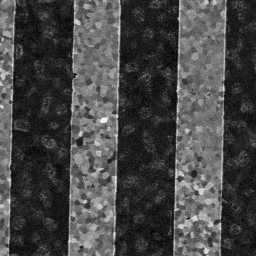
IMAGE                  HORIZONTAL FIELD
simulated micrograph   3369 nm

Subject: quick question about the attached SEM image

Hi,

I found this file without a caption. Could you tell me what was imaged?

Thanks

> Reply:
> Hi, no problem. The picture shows one or a few lines or trenches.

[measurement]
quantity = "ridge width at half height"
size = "599 nm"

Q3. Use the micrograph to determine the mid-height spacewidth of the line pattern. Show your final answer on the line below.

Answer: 0.786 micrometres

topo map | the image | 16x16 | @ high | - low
@----@@----@@@--
@----@@----@@@--
@----@@----@@@--
@----@@----@@@--
@----@@----@@@--
@----@@----@@@--
@----@@----@@@--
@---@@@----@@@--
@---@@@----@@@--
@---@@@----@@@--
@---@@@----@@@--
@---@@@----@@@--
@---@@@----@@@--
@---@@@----@@@--
@---@@@----@@@--
@---@@@----@@@--